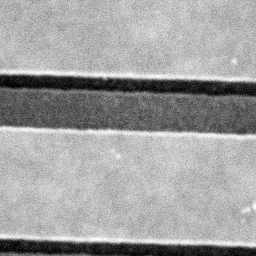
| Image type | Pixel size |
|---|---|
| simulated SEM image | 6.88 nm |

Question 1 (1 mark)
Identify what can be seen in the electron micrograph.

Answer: lines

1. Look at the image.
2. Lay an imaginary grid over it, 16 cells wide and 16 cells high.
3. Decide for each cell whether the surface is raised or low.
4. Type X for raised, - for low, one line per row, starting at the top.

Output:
XXXXXXXXXXXXXXXX
XXXXXXXXXXXXXXXX
XXXXXXXXXXXXXXXX
XXXXXXXXXXXXXXXX
XXXXXXXXXXXXXXXX
----------------
----------------
----------------
XXXXXXXXXXXXXXX-
XXXXXXXXXXXXXXXX
XXXXXXXXXXXXXXXX
XXXXXXXXXXXXXXXX
XXXXXXXXXXXXXXXX
XXXXXXXXXXXXXXXX
XXXXXXXXXXXXXXXX
----------------